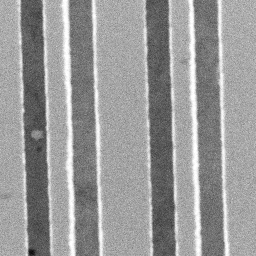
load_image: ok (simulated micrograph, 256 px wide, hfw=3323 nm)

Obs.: lines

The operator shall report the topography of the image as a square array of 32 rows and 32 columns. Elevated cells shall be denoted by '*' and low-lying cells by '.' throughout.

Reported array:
**...***....******...***...*****
**...***....******...***...*****
**....***...******...***...*****
**....***...******...***...*****
***...***...******...***...*****
***...***...******...***...*****
***...***...******...***....****
***...***...******...***....****
***...***...******...***....****
***...***...******...***....****
***...***...******....**....****
***...***...******....**....****
***...***...******....**....****
***...***...******....***...****
***...***...******....***...****
***...***...*******...***...****
***...***...*******...***...****
***...***...*******...***...****
***...***...*******...***...****
***...***...*******...***...****
***...***...*******...***...****
***...***...*******...***...****
***...***...*******...***...****
***...***...*******...***...****
***...***...*******...***...****
***...***...*******...***...****
***...***...*******...***...****
***...***....******...***...****
***...***....******...***...****
***...***....******...***...****
***...***....******...***...****
***...***....******...***...****